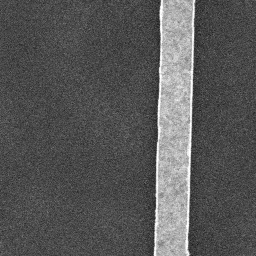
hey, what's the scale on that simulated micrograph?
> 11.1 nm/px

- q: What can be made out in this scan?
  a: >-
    one or a few lines or trenches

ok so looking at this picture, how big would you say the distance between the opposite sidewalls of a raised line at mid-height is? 353 nanometers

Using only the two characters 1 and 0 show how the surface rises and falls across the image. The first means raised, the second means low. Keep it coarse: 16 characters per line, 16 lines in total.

0000000000110000
0000000000110000
0000000000110000
0000000000110000
0000000000110000
0000000000110000
0000000000110000
0000000000110000
0000000000110000
0000000000110000
0000000000110000
0000000000110000
0000000000110000
0000000000110000
0000000000110000
0000000000110000